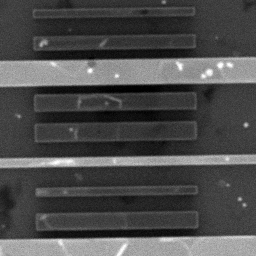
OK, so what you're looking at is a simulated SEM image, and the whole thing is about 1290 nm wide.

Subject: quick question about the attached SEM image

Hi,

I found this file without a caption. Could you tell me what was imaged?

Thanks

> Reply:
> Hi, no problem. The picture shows groups of lines, slits or small figures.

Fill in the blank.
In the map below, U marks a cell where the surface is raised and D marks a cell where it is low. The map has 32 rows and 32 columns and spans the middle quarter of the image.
UUUUUUUUUUUUUUUUUUUUUUUUUUUUUUUU
UUUUUUUUUUUUUUUUUUUUUUUUUUUUUUUU
UUUUUUUUUUUUUUUUUUUUUUUUUUUUUUUU
UUUUUUUUUUUUUUUUUUUUUUUUUUUUUUUU
UUUUUUUUUUUUUUUUUUUUUUUUUUUUUUUU
DDDDDDDDDDDDDDDDDDDDDDDDDDDDDDDD
DDDDDDDDDDDDDDDDDDDDDDDDDDDDDDDD
DDDDDDUUUUUUUUUUUUUUUUUUUUUUUUUU
UUUUUUUUUUUUUUUUUUUUUUUUUUUUUUUU
UUUUUUUUUUUUUUUUUUUUUUUUUUUUUUUU
UUUUUUUUUUUUUUUUUUUUUUUUUUUUUUUU
UUUUUUUUUUDDDDDDDDDDDDDDDDDDDDDD
DDDDDDDDDDDDDDDDDDDDDDDDDDDDDDDD
DDDDDDDDDDDDDDDDDDDDDDDDDDDDDDDD
DDDDDDDDDDDDDDDDDDDDDDDDDDDDDDDD
UUUUUUUUUUUUUUUUUUUUUUUUUUUUUUUU
UUUUUUUUUUUUUUUUUUUUUUUUUUUUUUUU
UUUUUUUUUUUUUUUUUUUUUUUUUUUUUUUU
UUUUUUUUUUUUUUUUUUUUUUUUUUUUUUUU
DDDDDDDDDDDDDDDDDDDDDDDDDDDDDDDD
DDDDDDDDDDDDDDDDDDDDDDDDDDDDDDDD
DDDDDDDDDDDDDDDDDDDDDDDDDDDDDDDD
DDDDDDDDDDDDDDDDDDDDDDDDDDDDDDDD
DDDDDDUUUUUUUUUUUUUUUUUUUUUUUUUU
UUUUUUUUUUUUUUUUUUUUUUUUUUUUUUUU
UUUUUUDDDDDDDDDDDDDDDDDDDDDDDDDD
DDDDDDDDDDDDDDDDDDDDDDDDDDDDDDDD
DDDDDDDDDDDDDDDDDDDDDDDDDDDDDDDD
DDDDDDDDDDDDDDDDDDDDDDDDDDDDDDDD
DDDDDDDDDDDDDDDDDDDDDDDDDDDDDDDD
DDDDDDDDDDDDDDDDDDDDDDDDDDDDDDDD
UUUUUUUUUUUUUUUUUUUUUUUUUUUUUUUU